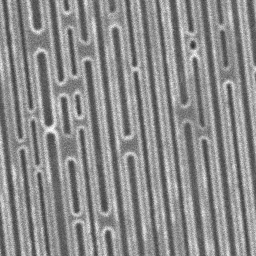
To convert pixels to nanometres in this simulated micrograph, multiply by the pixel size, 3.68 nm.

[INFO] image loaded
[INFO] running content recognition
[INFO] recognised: parallel lines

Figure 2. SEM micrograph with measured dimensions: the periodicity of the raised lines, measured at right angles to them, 55.9 nm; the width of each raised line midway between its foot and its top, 31.5 nm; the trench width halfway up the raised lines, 25.1 nm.